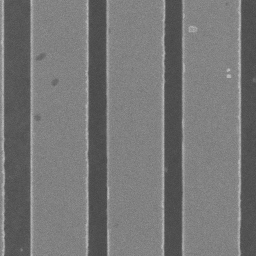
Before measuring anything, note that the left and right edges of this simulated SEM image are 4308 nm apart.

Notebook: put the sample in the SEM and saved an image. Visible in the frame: lines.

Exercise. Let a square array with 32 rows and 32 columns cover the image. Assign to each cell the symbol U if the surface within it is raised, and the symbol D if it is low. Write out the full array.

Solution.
DDDDUUUUUUUDDUUUUUUUUDDUUUUUUUDD
DDDDUUUUUUUDDUUUUUUUUDDUUUUUUUDD
DDDDUUUUUUUDDUUUUUUUUDDUUUUUUUDD
DDDDUUUUUUUDDUUUUUUUUDDUUUUUUUDD
DDDDUUUUUUUDDUUUUUUUUDDUUUUUUUDD
DDDDUUUUUUUDDUUUUUUUDDDUUUUUUUDD
DDDDUUUUUUUDDUUUUUUUUDDUUUUUUUDD
DDDDUUUUUUUDDUUUUUUUUDDUUUUUUUDD
DDDDUUUUUUUDDUUUUUUUUDDUUUUUUUDD
DDDDUUUUUUUDDUUUUUUUDDDUUUUUUUDD
DDDDUUUUUUUDDUUUUUUUUDDUUUUUUUDD
DDDDUUUUUUUDDUUUUUUUDDDUUUUUUUDD
DDDDUUUUUUUDDUUUUUUUDDDUUUUUUUDD
DDDDUUUUUUUDDUUUUUUUDDDUUUUUUUDD
DDDDUUUUUUUDDUUUUUUUDDDUUUUUUUDD
DDDDUUUUUUUDDUUUUUUUDDDUUUUUUUDD
DDDDUUUUUUUDDUUUUUUUDDDUUUUUUUDD
UDDDUUUUUUUDDUUUUUUUDDDUUUUUUUDD
DDDDUUUUUUUDDUUUUUUUDDDUUUUUUUDD
UDDDUUUUUUUDDUUUUUUUDDDUUUUUUUDD
UDDDUUUUUUUDDUUUUUUUDDDUUUUUUUDD
UDDDUUUUUUUDDUUUUUUUDDDUUUUUUUDD
UDDDUUUUUUUDDUUUUUUUDDDUUUUUUUDD
UDDDUUUUUUUDDUUUUUUUDDDUUUUUUUDD
UDDDUUUUUUUDDUUUUUUUDDDUUUUUUUDD
UDDDUUUUUUUDDUUUUUUUDDDUUUUUUUDD
UDDDUUUUUUUDDUUUUUUUDDDUUUUUUUDD
UDDDUUUUUUUDDUUUUUUUDDDUUUUUUUDD
UDDDUUUUUUUDDUUUUUUUDDDUUUUUUUDD
UDDDUUUUUUUDDUUUUUUUDDDUUUUUUUDD
UDDDUUUUUUUDDUUUUUUUDDDUUUUUUUDD
UDDDUUUUUUUDDUUUUUUUDDDUUUUUUUDD